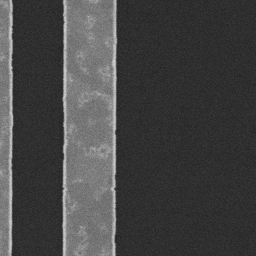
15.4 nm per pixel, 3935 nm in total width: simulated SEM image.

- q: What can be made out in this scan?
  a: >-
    one or a few lines or trenches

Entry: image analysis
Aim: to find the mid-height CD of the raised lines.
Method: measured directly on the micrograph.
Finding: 0.766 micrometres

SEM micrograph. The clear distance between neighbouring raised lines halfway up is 826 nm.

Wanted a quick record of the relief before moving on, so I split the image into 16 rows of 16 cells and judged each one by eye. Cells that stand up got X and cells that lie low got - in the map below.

X---XXX---------
X---XXX---------
X---XXX---------
X---XXX---------
X---XXX---------
X---XXX---------
X---XXX---------
X---XXX---------
X---XXX---------
X---XXX---------
X---XXX---------
X---XXX---------
X---XXX---------
X---XXX---------
X---XXX---------
X---XXX---------